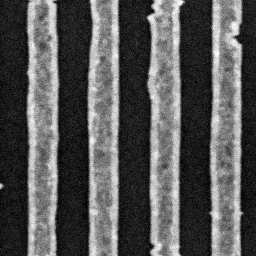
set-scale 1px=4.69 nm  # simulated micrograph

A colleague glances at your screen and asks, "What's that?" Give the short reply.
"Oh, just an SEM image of one or a few lines or trenches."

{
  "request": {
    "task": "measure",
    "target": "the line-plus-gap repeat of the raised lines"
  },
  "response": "287 nanometers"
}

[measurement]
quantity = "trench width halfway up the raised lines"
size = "181 nanometers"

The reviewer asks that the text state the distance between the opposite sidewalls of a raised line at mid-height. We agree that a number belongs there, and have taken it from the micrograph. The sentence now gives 0.105 um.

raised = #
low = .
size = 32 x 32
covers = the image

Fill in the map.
....###.....##......##.....###..
....###.....##......##.....###..
....##......##.....###.....###..
....###.....##.....###.....###..
....###.....##.....###.....##...
....###.....##.....###.....###..
....###.....##.....###.....###..
....###.....##.....###.....###..
....###.....##.....###.....###..
....###.....##.....###.....###..
....###.....##.....###.....###..
....###....###.....###.....###..
....###....###.....###.....###..
....###....###......##.....###..
....###....###......##.....###..
....###....###.....###.....###..
....###....###.....###.....###..
....###....###.....###.....###..
....###....###.....###.....###..
....###....###.....###.....###..
....###....###.....###.....###..
....###.....##.....###.....###..
....###.....##.....###.....###..
....###.....##.....###.....###..
....###.....##.....###.....###..
....###.....##.....###.....###..
....###.....##.....###.....###..
....##......##.....###.....###..
....###.....##.....###.....###..
....###.....##.....###.....###..
....###.....##......##.....###..
....###.....##.....###.....###..